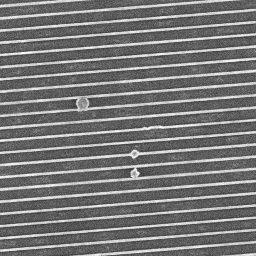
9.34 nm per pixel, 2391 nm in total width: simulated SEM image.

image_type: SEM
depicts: parallel lines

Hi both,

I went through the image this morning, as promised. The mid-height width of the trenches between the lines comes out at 10.2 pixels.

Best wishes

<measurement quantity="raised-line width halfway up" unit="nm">17.5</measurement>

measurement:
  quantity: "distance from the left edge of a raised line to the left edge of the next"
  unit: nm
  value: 114